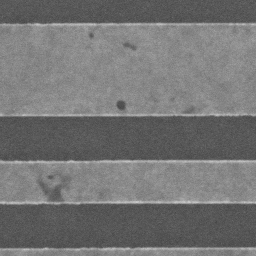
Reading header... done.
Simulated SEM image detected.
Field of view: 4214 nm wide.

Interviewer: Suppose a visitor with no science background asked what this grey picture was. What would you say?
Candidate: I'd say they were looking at lines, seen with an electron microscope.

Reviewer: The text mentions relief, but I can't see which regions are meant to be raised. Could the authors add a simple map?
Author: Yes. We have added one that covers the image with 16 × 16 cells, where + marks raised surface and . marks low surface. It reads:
................
+.++++++++++++++
++++++++++++++++
++++++++++++++++
++++++++++++++++
++++++++++++++++
++++++++++++++++
................
................
................
++++++++++++++++
++++++++++++++++
++++++++++++++++
................
................
................